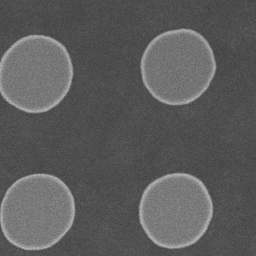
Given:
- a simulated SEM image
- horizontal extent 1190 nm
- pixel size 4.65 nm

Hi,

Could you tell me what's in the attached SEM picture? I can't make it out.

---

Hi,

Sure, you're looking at raised bodies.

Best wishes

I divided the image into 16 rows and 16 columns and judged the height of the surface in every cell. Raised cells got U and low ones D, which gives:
DDDDDDDDDDDDDDDD
DDDDDDDDDDDDDDDD
DUUDDDDDDDUUUDDD
UUUUDDDDDUUUUDDD
UUUUUDDDDUUUUDDD
UUUUDDDDDUUUUDDD
DUUUDDDDDDDDDDDD
DDDDDDDDDDDDDDDD
DDDDDDDDDDDDDDDD
DDDDDDDDDDDDDDDD
DDDDDDDDDDDDDDDD
DUUUDDDDDDUUUDDD
UUUUUDDDDUUUUDDD
UUUUUDDDDUUUUDDD
UUUUDDDDDUUUUDDD
DUUDDDDDDDDDDDDD